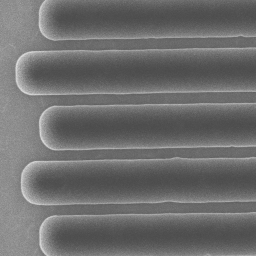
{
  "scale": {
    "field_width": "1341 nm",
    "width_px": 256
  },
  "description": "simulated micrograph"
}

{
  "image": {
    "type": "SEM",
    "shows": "parallel lines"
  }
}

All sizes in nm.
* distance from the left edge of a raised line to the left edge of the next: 288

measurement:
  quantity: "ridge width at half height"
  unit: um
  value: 0.227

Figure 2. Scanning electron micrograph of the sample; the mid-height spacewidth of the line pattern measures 58.3 nanometers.